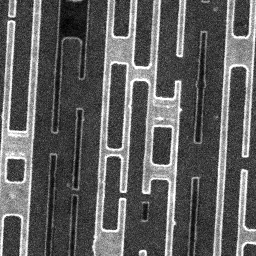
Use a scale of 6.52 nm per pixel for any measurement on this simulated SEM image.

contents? parallel lines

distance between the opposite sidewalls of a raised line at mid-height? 40.7 nm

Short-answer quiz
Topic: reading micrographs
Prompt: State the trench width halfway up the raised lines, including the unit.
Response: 0.117 µm